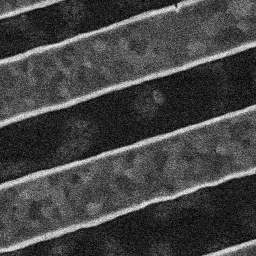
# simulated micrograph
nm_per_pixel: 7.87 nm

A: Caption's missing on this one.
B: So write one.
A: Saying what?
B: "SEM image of one or a few lines or trenches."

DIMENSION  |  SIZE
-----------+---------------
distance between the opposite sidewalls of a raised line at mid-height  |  477 nm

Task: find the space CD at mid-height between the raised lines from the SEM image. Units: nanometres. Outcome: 469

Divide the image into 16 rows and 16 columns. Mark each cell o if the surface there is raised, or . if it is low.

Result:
oo.........ooooo
.......ooooooooo
....oooooooooooo
.ooooooooooooo..
ooooooooooo.....
ooooooo.........
oooo............
o............ooo
..........oooooo
.......ooooooooo
....oooooooooooo
ooooooooooooo...
oooooooooo......
ooooooo.........
oooo............
o..............o